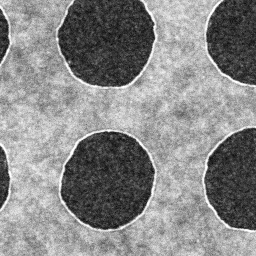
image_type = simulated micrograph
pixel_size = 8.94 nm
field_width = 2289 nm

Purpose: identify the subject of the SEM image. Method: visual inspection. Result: holes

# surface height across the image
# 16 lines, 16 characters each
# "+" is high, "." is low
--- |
++++.....++++...
.+++......+++...
.+++......+++...
++++.....++++...
++++.....+++++..
++++++++++++++++
++++++++++++++++
++++++++++++++++
+++++...++++++..
+++++....++++...
.+++......+++...
.+++......+++...
++++.....++++...
+++++....+++++..
++++++++++++++++
++++++++++++++++